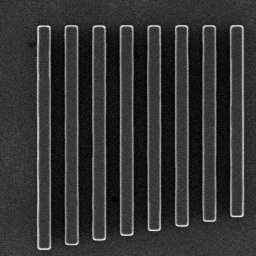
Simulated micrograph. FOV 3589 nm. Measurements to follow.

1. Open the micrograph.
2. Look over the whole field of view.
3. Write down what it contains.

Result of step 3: groups of lines, slits or small figures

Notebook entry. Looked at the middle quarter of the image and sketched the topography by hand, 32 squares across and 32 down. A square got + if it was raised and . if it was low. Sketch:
+++....+++....+++....+++....+++.
+++....+++....+++....+++....+++.
+++....+++....+++....+++....+++.
+++....+++....+++....+++....+++.
+++....+++....+++....+++....+++.
+++....+++....+++....+++....+++.
+++....+++....+++....+++....+++.
.++....+++....+++....+++....+++.
.++....+++....+++....+++....+++.
.++....+++....+++....+++....+++.
.++....+++....+++....+++....+++.
.++....+++....+++....+++....+++.
.++....+++....+++....+++....+++.
.++....+++....+++....+++....+++.
+++....+++....+++....+++....+++.
+++....+++....+++....+++....+++.
+++....+++....+++....+++....+++.
+++....+++....+++....+++....+++.
.++....+++....+++....+++....+++.
.++....+++....+++....+++....+++.
.++....+++....+++....+++....+++.
.++....+++....+++....+++....+++.
.++....+++....+++....+++....+++.
.++....+++....+++....+++....+++.
.++....+++....+++....+++....+++.
.++....+++....+++....+++....+++.
.++....+++....+++....+++....+++.
.++....+++....+++....+++....+++.
.++....+++....+++....+++....+++.
.++....+++....+++....+++....+++.
.++....+++....+++....+++....+++.
.++....+++....+++....+++....+++.